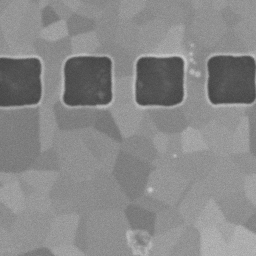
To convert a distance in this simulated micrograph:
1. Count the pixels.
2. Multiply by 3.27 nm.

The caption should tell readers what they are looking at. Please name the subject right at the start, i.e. holes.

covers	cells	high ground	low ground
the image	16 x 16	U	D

UUUUUUUUUUUUUUUU
UUUUUUUUUUUUUUUU
UUUUUUUUUUUUUUUU
UUUUUDUUUUUUUDDD
DDDUDDDUDDDDUDDD
DDDUDDDUDDDDUDDD
DDUUDDDUUDDUUDDU
UUUUUUUUUUUUUUUU
UUUUUUUUUUUUUUUU
UUUUUUUUUUUUUUUU
UUUUUUUUUUUUUUUU
UUUUUUUUUUUUUUUU
UUUUUUUUUUUUUUUU
UUUUUUUUUUUUUUUU
UUUUUUUUUUUUUUUU
UUUUUUUUUUUUUUUU